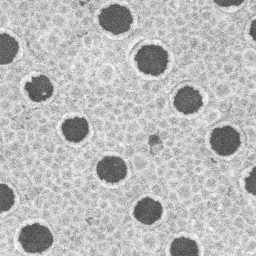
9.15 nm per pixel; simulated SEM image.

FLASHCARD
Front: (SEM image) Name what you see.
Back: a regular array of holes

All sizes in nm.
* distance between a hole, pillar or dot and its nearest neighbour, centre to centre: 483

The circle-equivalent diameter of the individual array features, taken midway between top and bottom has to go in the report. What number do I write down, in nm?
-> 261